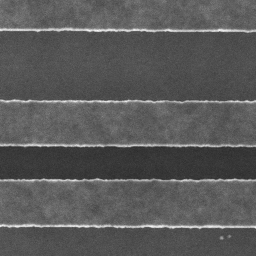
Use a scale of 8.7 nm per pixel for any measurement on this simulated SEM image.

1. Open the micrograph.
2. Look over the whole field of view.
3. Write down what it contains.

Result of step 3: lines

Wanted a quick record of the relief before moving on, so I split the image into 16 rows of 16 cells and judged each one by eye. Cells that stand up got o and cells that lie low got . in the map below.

oooooooooooooooo
oooooooooooooooo
................
................
................
................
oooooooooooooooo
oooooooooooooooo
oooooooooooooooo
................
................
oooooooooooooooo
oooooooooooooooo
oooooooooooooooo
................
................